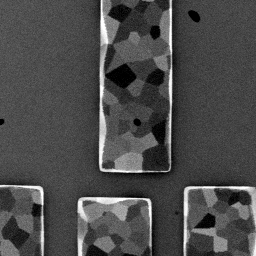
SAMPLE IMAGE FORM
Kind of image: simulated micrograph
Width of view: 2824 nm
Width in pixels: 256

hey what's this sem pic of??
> wiring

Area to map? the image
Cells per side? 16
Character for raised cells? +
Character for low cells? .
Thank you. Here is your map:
......+++++.....
......+++++.....
.......++++.....
......+++++.....
......+++++.....
......+++++.....
......+++++.....
......+++++.....
......+++++.....
......+++++.....
.......+++......
................
+++..++++...++++
+++..++++...++++
+++..++++...++++
+++..++++...++++